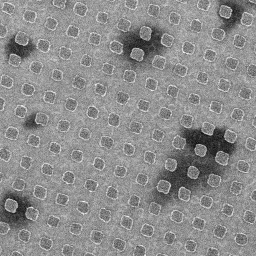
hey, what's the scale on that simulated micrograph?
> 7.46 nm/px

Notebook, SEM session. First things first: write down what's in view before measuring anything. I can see a regular array of raised bodies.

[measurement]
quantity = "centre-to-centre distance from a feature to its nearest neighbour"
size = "169 nm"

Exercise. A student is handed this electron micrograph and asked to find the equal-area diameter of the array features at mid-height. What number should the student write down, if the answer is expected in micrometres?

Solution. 0.093